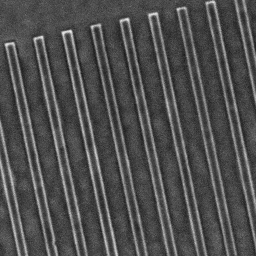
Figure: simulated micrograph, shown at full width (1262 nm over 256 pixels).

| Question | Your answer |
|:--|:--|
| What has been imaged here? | parallel lines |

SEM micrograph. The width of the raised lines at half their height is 0.0435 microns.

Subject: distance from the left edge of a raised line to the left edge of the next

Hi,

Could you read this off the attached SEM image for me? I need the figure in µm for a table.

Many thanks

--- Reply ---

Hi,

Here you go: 0.144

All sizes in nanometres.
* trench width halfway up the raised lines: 102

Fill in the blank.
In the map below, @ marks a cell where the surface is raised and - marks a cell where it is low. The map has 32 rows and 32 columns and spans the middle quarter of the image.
--@@-----@@-----@@------@@-----@
--@@-----@@------@@-----@@-----@
--@@-----@@------@@-----@@------
--@@-----@@@-----@@-----@@@-----
--@@------@@-----@@------@@-----
--@@@-----@@-----@@@-----@@-----
--@@@-----@@------@@-----@@-----
---@@-----@@------@@-----@@-----
---@@-----@@@-----@@------@@----
---@@@-----@@-----@@------@@----
----@@-----@@-----@@@-----@@----
----@@-----@@------@@-----@@----
----@@-----@@------@@-----@@----
----@@-----@@@-----@@------@@---
----@@@-----@@-----@@------@@---
-----@@-----@@-----@@@-----@@---
-----@@-----@@------@@-----@@---
-----@@-----@@------@@-----@@@--
-----@@-----@@@-----@@------@@--
-----@@@-----@@-----@@------@@--
-----@@@-----@@-----@@@-----@@--
------@@-----@@------@@-----@@--
@-----@@-----@@------@@-----@@@-
@-----@@-----@@@-----@@------@@-
@-----@@@-----@@-----@@------@@-
@------@@-----@@-----@@@-----@@-
@------@@-----@@------@@-----@@-
@@-----@@-----@@------@@-----@@@
@@-----@@------@@-----@@------@@
@@-----@@@-----@@-----@@------@@
@@------@@-----@@-----@@@-----@@
@@------@@-----@@------@@-----@@